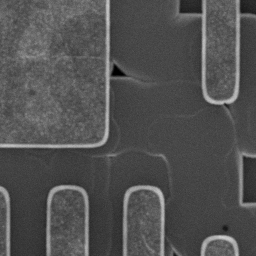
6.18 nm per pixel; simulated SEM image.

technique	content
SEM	wiring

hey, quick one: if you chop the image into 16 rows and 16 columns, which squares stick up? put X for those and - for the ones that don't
XXXXXXX------XX-
XXXXXXX------XX-
XXXXXXX------XX-
XXXXXXX------XX-
XXXXXXX------XX-
XXXXXXX------XX-
XXXXXXX---------
XXXXXXX---------
XXXXXXX---------
----------------
----------------
----------------
---XX---XX------
---XX---XX------
---XX---XX------
---XX---XX---XX-